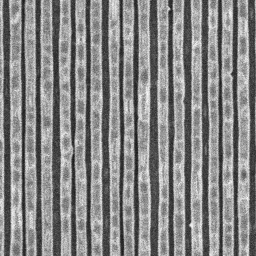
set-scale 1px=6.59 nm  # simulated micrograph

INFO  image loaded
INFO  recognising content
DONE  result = parallel lines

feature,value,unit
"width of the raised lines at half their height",9.14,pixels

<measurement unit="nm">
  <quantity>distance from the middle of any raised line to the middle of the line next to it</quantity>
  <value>107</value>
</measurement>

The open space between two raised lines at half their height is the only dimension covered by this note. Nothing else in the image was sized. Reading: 42 nanometers